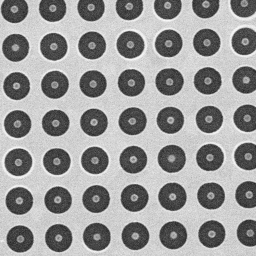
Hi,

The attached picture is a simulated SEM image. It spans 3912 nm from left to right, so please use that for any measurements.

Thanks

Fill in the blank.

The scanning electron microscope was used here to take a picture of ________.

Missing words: an array of small figures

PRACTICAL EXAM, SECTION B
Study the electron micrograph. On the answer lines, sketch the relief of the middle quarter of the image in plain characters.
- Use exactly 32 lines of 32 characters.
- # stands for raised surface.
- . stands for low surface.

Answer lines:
################################
###############....#####.....###
#####.....####......###......###
.###......####......###.......##
.###...#...##...#...###...#...##
.###...#...##.......###.......##
.###.......###......####.....###
#####.....#####....#####....####
################################
################################
##########################.#####
######...######.....####.....###
.####.....####......###.......##
.###.......###.......##.......##
..##...#...##...##...##...#...##
.###.......###.......##.......##
.####......###......####.....###
#####.....######...#######.#####
################################
################################
#################.#######....###
#####.....#####.....####......##
.###.......###.......##.......##
..##...#...###...#...##........#
..##...#...###...#...##........#
..##.......###.......###......##
.####......####.....#####....###
######...#######################
################################
##########################..####
######....#####....######....###
.####......####......###......##